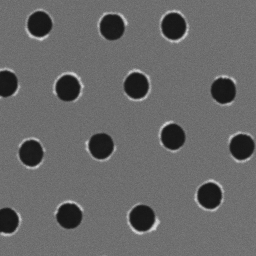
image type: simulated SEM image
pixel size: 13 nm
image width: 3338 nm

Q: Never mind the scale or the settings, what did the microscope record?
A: a regular array of holes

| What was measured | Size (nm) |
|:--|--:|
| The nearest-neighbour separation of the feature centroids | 822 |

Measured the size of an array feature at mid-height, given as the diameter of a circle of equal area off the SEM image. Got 0.341 microns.